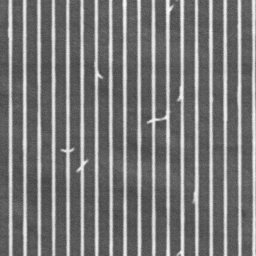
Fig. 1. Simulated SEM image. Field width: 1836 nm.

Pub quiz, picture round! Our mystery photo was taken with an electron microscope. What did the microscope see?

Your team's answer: parallel lines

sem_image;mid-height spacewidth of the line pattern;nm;85.1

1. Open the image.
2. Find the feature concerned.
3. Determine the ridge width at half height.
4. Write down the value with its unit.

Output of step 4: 0.0197 µm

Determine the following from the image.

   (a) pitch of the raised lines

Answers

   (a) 14.3 pixels